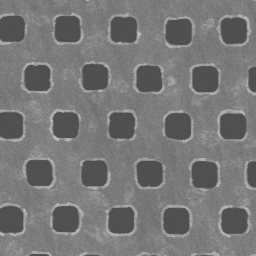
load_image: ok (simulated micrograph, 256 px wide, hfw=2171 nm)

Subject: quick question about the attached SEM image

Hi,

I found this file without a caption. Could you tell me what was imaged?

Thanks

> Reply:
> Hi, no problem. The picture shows a regular array of holes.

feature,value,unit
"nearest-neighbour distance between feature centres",460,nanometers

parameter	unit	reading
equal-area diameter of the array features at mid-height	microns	0.239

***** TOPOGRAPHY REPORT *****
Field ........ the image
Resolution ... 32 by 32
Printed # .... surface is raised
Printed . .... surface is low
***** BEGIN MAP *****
################################
################################
...####...####...#####.#####...#
...####...####...####...####...#
...####...####...####...####...#
#####################..#########
################################
################################
###...####...####...####...####.
###...####...####...####...####.
###...####...####...####...####.
##################.######.######
################################
################################
...####...####...####...####..##
...####...####...####...###....#
...####...####...####...####...#
################################
################################
################################
###...####...####...####...####.
###....###...####...####...####.
####...###...####...####...####.
################################
################################
################################
...####...####...####..#####...#
...####...###....###....####...#
...####...####...###....####...#
################################
################################
################################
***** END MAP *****